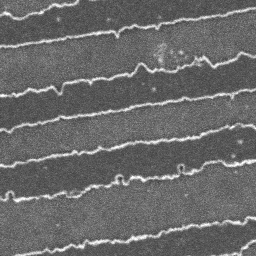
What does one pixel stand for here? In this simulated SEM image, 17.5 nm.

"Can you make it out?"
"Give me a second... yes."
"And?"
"one or a few lines or trenches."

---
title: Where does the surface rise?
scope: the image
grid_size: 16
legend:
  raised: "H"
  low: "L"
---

LLLHHHHHHHHHHHHH
HHHHHHHHHHLLLLLL
HHHHLLLLLLLLLLLL
LLLLLLLLLLLLLLLH
LLLLLLLLHHHHHHHH
LLLLHHHHHHHHHHHH
HHHHHHHHHHLLLLLL
HHHLLLLLLLLLLLLL
LLLLLLLLLLLLHHHH
LLLLLLHHHHHHHHHH
HHHHHHHHHHHHHLLL
HHHHHHHLLLLLLLLL
LLLLLLLLLLLLLLLL
LLLLLLLLLLLLLLLL
LLLLLLLLLLHHHHHH
LLLLHHHHHHHHHHHL